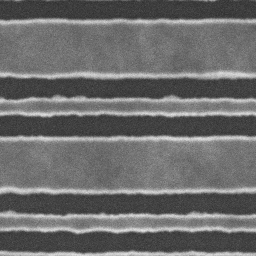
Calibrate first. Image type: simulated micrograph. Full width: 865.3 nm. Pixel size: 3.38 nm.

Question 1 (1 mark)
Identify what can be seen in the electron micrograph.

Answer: lines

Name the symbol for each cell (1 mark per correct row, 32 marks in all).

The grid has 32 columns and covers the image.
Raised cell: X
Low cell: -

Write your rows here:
--------------------------------
--------------------------------
----XXXXX-----XX---XX----XXXXXXX
XXXXXXXXXXXXXXXXXXXXXXXXXXXXXXXX
XXXXXXXXXXXXXXXXXXXXXXXXXXXXXXXX
XXXXXXXXXXXXXXXXXXXXXXXXXXXXXXXX
XXXXXXXXXXXXXXXXXXXXXXXXXXXXXXXX
XXXXXXXXXXXXXXXXXXXXXXXXXXXXXXXX
XXXXXXXXXXXXXXXXXXXXXXXXXXXXXXXX
--XXXXXXX--XXXXXXXXXXXXXXXXXXXXX
--------------------------------
--------------------------------
X-XXXXXXXXXXXXXXXXXXXXXXXXXXXXXX
XXXXXXXXXXXXXXXXXXXXXXXXXXXXXXXX
-----X---------------X----------
--------------------------------
--------------------------------
XXXXXXXXXXXXXXXXXXXXXXXXXXXXXXXX
XXXXXXXXXXXXXXXXXXXXXXXXXXXXXXXX
XXXXXXXXXXXXXXXXXXXXXXXXXXXXXXXX
XXXXXXXXXXXXXXXXXXXXXXXXXXXXXXXX
XXXXXXXXXXXXXXXXXXXXXXXXXXXXXXXX
XXXXXXXXXXXXXXXXXXXXXXXXXXXXXXXX
XXXXXXXXXXXXXXXXXXXXXXXXXXXXXXXX
--------------------------------
--------------------------------
--------------------------------
XXXXXXXXXXXXXXXXXXXXXXXXXXXXXXXX
XXXXXXXXXXXXXXXXXXXXXXXXXXXXXXXX
--------------------------------
--------------------------------
X---------------X------XX-------